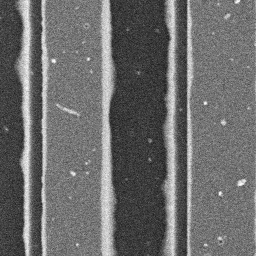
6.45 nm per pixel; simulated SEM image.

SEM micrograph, lines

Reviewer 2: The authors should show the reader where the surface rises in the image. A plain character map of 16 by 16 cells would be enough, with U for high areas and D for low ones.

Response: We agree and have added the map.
DDUUUUUDDDDUUUUU
DDUUUUUDDDDUUUUU
DDUUUUUDDDDUUUUU
DDUUUUUDDDDUUUUU
DDUUUUUDDDDUUUUU
DDUUUUUDDDDUUUUU
DDUUUUUDDDDUUUUU
DDUUUUUDDDDUUUUU
DDUUUUUDDDDUUUUU
DDUUUUUDDDDUUUUU
DDUUUUUDDDDUUUUU
DDUUUUUDDDDUUUUU
DDUUUUUDDDDUUUUU
DDUUUUUDDDDUUUUU
DDUUUUUDDDDUUUUU
DDUUUUUDDDDUUUUU